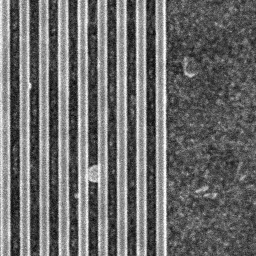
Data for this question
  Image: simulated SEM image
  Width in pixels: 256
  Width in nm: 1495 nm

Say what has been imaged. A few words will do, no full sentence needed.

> parallel lines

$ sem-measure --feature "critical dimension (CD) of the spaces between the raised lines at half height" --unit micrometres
0.0635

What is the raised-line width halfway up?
8.87 pixels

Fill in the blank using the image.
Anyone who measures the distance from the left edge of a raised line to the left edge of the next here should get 19.5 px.